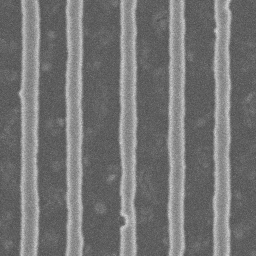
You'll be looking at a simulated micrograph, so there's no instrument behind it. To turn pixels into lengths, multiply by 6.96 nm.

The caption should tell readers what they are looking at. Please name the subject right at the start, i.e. parallel lines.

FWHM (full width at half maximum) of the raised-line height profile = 99.2 nm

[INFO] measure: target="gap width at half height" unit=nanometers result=231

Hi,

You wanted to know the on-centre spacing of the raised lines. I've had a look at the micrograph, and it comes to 335 nm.